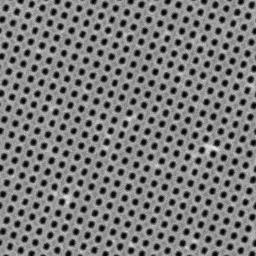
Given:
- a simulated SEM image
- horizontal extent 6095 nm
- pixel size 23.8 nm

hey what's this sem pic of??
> a regular array of holes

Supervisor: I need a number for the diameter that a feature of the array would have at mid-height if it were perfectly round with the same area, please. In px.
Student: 7.9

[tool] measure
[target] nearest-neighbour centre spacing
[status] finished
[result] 0.27 µm